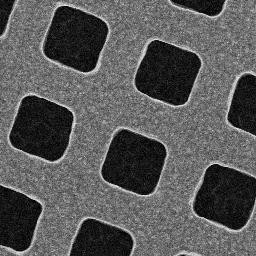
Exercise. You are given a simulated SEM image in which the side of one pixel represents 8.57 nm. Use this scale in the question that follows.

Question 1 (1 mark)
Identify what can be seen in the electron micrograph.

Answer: holes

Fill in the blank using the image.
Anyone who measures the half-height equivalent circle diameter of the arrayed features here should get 62.5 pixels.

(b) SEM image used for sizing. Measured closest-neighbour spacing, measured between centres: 0.819 um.